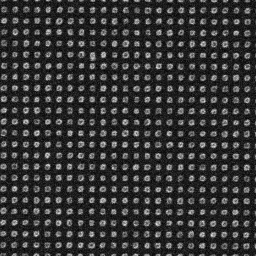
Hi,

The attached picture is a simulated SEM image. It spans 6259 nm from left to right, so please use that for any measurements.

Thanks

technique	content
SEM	a regular array of raised bodies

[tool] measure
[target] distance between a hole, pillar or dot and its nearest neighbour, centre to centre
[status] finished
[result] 266 nm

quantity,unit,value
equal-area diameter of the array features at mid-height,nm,123